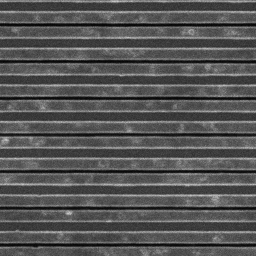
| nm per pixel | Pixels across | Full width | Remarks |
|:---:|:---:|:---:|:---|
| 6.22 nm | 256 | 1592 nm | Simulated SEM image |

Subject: parallel lines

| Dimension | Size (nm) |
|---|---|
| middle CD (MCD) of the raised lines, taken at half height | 73.8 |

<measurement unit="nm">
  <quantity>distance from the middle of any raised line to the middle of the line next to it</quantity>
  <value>114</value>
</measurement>